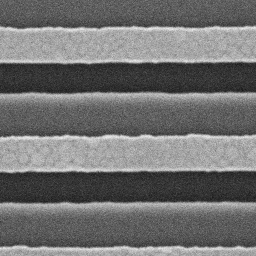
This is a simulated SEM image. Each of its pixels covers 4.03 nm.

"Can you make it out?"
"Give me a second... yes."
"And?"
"lines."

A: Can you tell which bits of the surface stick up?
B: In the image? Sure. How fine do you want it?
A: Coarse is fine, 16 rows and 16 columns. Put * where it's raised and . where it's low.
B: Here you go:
****************
****************
****************
****************
................
................
****************
****************
****************
****************
****************
................
................
****************
****************
****************